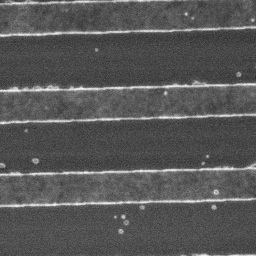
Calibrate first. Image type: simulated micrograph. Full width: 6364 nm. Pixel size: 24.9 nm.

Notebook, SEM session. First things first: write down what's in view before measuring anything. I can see lines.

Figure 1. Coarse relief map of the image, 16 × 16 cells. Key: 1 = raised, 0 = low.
1111111111111111
1111111111111111
0000000000000000
0000000000000000
0000000000000000
0000001111111111
1111111111111111
1111110000000000
0000000000000000
0000000000000000
0000000000000000
1111111111111111
1111111111111100
0000000000000000
0000000000000000
0000000000000000